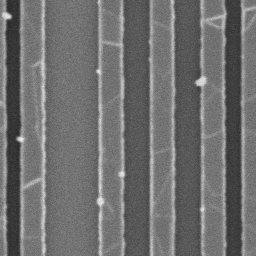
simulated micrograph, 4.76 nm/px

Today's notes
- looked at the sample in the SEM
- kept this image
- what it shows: lines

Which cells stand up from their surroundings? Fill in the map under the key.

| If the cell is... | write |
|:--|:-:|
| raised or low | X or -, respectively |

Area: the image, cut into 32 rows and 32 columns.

X--XX-------XXX----XXX---XXX--XX
X--XX-------XXX----XXX---XXX--XX
X--XX-------XXX----XXX---XXX--XX
X--XX-------XXX----XXX---XXX--XX
X--XX-------XXX----XXX---XXX--XX
X--XX-------XXX----XXX---XXX--XX
X--XX-------XXX----XXX---XXX--XX
X--XX-------XXX----XXX---XXX--XX
X--XX-------XXX----XXX---XXX--XX
X--XX-------XXX----XXX---XXX--XX
X--XX-------XXX----XXX---XXX--XX
X--XX-------XXX----XXX---XXX--XX
X--XX-------XXX----XXX---XXX--XX
X--XX-------XXX----XXX---XXX--XX
X--XXX------XXX----XXX---XXX--XX
X--XXX------XXX----XXX---XXX--XX
X--XXX------XXX----XXX---XXX--XX
X-XXXX------XXX----XXX---XXX--XX
X--XX-------XXX----XXX---XXX--XX
X--XXX------XXX----XXX---XXX--XX
X--XXX------XXX----XXX---XXX--XX
X--XXX------XXXX---XXX---XXX--XX
X--XXX------XXX----XXX---XXX--XX
X--XXX------XXX----XXX---XXX--XX
X--XXX------XXX----XXX---XXX--XX
X--XXX------XXX----XXX---XXX--XX
X--XXX------XXX----XXX---XXX--XX
X--XX-------XXX----XXX---XXX--XX
X--XX-------XXX----XXX---XXX--XX
X--XXX------XXX----XXX---XXX--XX
X--XXX------XXXX---XXX---XXX--XX
X--XXX------XXX----XXX---XXX--XX